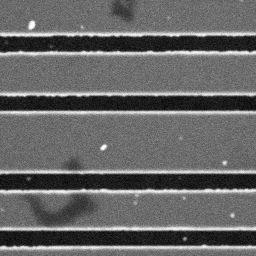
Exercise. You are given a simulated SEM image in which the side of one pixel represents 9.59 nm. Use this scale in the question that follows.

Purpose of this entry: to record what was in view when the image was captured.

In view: lines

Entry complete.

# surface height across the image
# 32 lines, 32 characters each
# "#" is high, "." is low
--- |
################################
################################
################################
################################
................................
................................
..#...##..###.#...#.############
################################
################################
################################
################################
################################
................................
................................
################################
################################
################################
################################
################################
################################
################################
################################
................................
................................
################################
################################
################################
################################
################################
................................
................................
################################